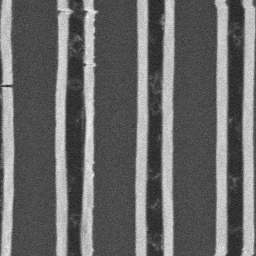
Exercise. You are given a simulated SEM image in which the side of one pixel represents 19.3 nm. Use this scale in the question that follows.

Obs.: one or a few lines or trenches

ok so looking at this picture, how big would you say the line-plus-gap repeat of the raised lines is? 1.55 microns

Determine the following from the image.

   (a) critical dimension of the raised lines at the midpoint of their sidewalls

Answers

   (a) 509 nanometers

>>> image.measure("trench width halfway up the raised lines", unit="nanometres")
1040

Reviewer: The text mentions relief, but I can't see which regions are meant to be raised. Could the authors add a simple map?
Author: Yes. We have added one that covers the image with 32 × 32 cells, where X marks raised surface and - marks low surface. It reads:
X-------XXX-------XXX-------XXX-
X-------XXX-------XXX-------XXX-
X-------XXX-------XXX-------XXX-
X-------XXX-------XXX-------XXX-
X-------XXX-------XXX-------XXX-
X-------XXX-------XXX-------XXX-
X-------XXX-------XXX-------XXX-
X-------XXX-------XXX-------XXX-
X-------XXX-------XXX-------XXX-
X-------XXX-------XXX-------XXX-
X-------XXX-------XXX-------XXX-
X-------XXX-------XXX-------XXX-
X-------XXX-------XXX-------XXX-
X-------XXX-------XXX-------XXX-
X-------XXX-------XXX-------XXX-
X-------XXX-------XXX-------XXX-
X-------XXX-------XXX-------XXX-
X-------XXX-------XXX-------XXX-
X-------XXX-------XXX-------XXX-
X-------XXX-------XXX-------XXX-
X-------XXX-------XXX-------XXX-
X-------XXX-------XXX-------XXX-
X-------XXX-------XXX-------XXX-
X-------XXX-------XXX-------XXX-
X-------XXX-------XXX-------XXX-
X-------XXX-------XXX-------XXX-
X-------XXX-------XXX-------XXX-
X-------XXX-------XXX-------XXX-
X-------XXX-------XXX-------XXX-
X-------XXX-------XXX-------XXX-
X-------XXX-------XXX-------XXX-
X-------XXX-------XXX-------XXX-